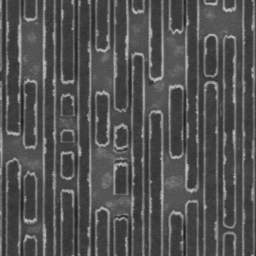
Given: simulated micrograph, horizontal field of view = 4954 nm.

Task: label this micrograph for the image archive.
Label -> parallel lines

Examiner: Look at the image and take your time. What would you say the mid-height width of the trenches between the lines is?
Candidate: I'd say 0.114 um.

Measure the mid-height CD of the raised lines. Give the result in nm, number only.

232